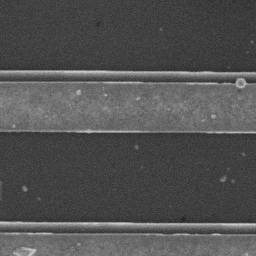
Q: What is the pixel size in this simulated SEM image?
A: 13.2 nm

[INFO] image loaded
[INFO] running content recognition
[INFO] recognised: lines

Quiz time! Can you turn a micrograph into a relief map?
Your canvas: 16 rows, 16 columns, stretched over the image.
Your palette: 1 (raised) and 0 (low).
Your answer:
0000000000000000
0000000000000000
0000000000000000
0000000000000000
0000000000000000
1111111111111111
1111111111111111
1111111111111111
0000000000000000
0000000000000000
0000000000000000
0000000000000000
0000000000000000
0000000000000000
0000000000000000
1111111111111111